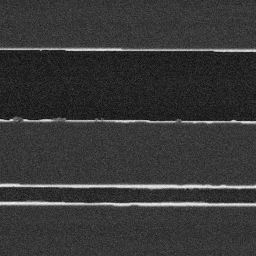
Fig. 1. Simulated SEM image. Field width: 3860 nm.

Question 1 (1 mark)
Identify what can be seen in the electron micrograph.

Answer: lines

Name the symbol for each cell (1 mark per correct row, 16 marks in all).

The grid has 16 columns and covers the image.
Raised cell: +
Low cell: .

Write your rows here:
++++++++++++++++
++++++++++++++++
++++++++++++++++
................
................
................
................
+++++++.........
++++++++++++++++
++++++++++++++++
++++++++++++++++
++++++++++++++++
++++++++++++++++
++++++++++++++++
++++++++++++++++
++++++++++++++++